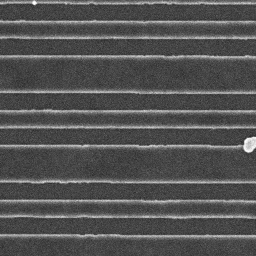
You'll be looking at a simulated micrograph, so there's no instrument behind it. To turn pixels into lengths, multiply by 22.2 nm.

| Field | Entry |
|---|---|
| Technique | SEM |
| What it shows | lines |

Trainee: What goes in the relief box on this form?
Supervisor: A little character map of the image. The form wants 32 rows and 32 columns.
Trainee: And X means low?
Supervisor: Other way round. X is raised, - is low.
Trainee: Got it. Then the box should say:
--------------------------------
--------------------------------
--------------------------------
XXXXXXXXXXXXXXXXXXXXXXXXXXXXXXXX
XXXXXXXXXXXXXXXXXXXXXXXXXXXXXXXX
--------------------------------
--------------------------------
XXXXXXXXXXXXXXXXXXXXXXXXXXXXXXXX
XXXXXXXXXXXXXXXXXXXXXXXXXXXXXXXX
XXXXXXXXXXXXXXXXXXXXXXXXXXXXXXXX
XXXXXXXXXXXXXXXXXXXXXXXXXXXXXXXX
XXXXXXXXXXXXXXXXXXXXXXXXXXXXXXXX
--------------------------------
--------------------------------
XXXXXXXXXXXXXXXXXXXXXXXXXXXXXXXX
XXXXXXXXXXXXXXXXXXXXXXXXXXXXXXXX
--------------------------------
-------------------------------X
XXXXXXXXXXXXXXXXXXXXXXXXXXXXXXXX
XXXXXXXXXXXXXXXXXXXXXXXXXXXXXXXX
XXXXXXXXXXXXXXXXXXXXXXXXXXXXXXXX
XXXXXXXXXXXXXXXXXXXXXXXXXXXXXXXX
XXXXXXXXXXXXXXXXXXXXXXXXXXXXXXXX
--------------------------------
--------------------------------
XXXXXXXXXXXXXXXXXXXXXXXXXXXXXXXX
XXXXXXXXXXXXXXXXXXXXXXXXXXXXXXXX
--------------------------------
--------------------------------
XXXXXXXXXXXXXXXXXXXXXXXXXXXXXXXX
XXXXXXXXXXXXXXXXXXXXXXXXXXXXXXXX
XXXXXXXXXXXXXXXXXXXXXXXXXXXXXXXX